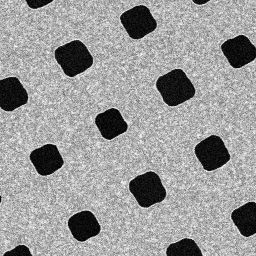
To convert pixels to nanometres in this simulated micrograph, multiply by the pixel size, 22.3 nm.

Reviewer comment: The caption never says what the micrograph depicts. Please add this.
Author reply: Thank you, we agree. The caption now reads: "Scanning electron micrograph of a regular array of holes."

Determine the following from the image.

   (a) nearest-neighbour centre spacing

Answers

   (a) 1640 nm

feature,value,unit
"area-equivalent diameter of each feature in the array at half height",753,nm